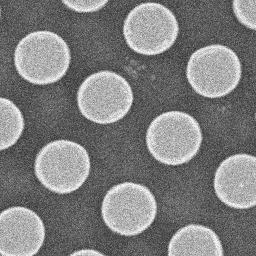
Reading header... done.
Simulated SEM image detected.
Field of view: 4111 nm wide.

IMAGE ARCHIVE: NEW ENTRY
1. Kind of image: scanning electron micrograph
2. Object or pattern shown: raised bodies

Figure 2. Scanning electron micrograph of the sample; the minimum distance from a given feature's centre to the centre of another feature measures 1.22 micrometres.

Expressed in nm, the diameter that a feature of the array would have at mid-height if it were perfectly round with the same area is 844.